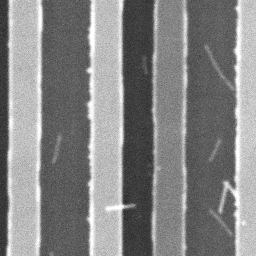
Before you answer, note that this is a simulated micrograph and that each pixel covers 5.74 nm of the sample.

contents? lines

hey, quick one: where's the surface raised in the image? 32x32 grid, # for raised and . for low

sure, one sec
.####.......###....####.......##
.####.......###....####.......##
.####.......###....####.......##
.####.......###....####.......##
.####.......###....####.......##
.####.......###....####.......##
.####.......###....####.......##
.####.......###....####.......##
.####.......###....####.......##
.####......####....####.......##
.####......####....####.......##
.####......####....####.......##
.####.......###....####.......##
.####.......###....####.......##
.####.......###....####.......##
.####.......###....####.......##
.####.......###....####.......##
.####.......###....####.......##
.####.......###....####.......##
.####.......###....####.......##
.####.......###....####.......##
.####.......###....####.......##
.####.......###....####.......##
.####......####....####.......##
.####......####....####.......##
.####......####....####.......##
.####......####....####.......##
.####......####....####.......##
.####......####....####.......##
.####......####....####.......##
.####......####....####.......##
.####......####....####.......##